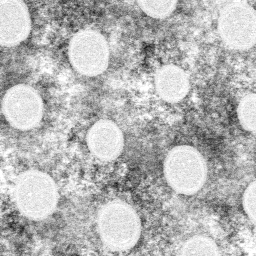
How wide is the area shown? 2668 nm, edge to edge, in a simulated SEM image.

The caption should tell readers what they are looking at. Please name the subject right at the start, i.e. raised bodies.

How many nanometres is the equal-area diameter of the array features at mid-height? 428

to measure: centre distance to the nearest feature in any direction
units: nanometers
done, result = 895